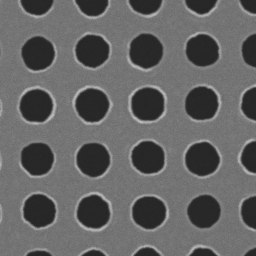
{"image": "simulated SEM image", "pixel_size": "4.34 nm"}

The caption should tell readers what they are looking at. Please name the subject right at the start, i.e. a regular array of holes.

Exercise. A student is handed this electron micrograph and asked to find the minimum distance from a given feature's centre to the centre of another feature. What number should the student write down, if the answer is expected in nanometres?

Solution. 230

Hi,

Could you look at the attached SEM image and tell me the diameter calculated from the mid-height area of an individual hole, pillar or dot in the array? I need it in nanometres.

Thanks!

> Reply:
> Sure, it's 145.